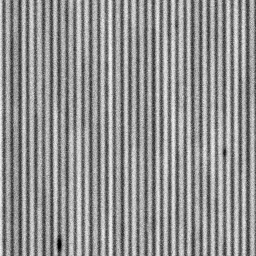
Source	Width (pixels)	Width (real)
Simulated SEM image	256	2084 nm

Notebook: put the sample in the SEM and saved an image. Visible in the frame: parallel lines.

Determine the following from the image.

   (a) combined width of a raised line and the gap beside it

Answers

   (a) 0.064 microns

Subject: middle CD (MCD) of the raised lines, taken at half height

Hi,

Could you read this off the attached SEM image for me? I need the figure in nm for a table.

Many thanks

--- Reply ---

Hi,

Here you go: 28.5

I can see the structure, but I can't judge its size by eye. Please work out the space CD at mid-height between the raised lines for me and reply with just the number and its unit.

36.6 nanometers